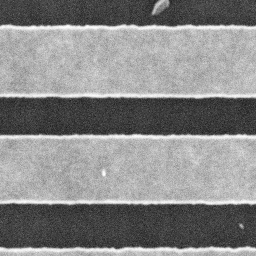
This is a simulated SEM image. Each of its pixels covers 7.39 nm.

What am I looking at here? lines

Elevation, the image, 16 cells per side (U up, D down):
DDDDDDDDDDDDDDDD
DDDDDDDDDDDDDDDD
UUUUUUUUUUUUUUUU
UUUUUUUUUUUUUUUU
UUUUUUUUUUUUUUUU
UUUUUUUUUUUUUUUU
DDDDDDDDDDDDDDDD
DDDDDDDDDDDDDDDD
UUUUUUUUUUUUUUUU
UUUUUUUUUUUUUUUU
UUUUUUUUUUUUUUUU
UUUUUUUUUUUUUUUU
UUUUUUUUUUUUUUUU
DDDDDDDDDDDDDDDD
DDDDDDDDDDDDDDDD
DDDDDDDDDDDDDDDD